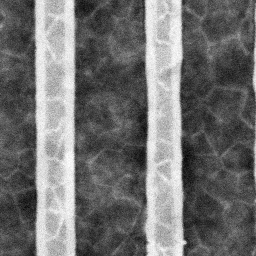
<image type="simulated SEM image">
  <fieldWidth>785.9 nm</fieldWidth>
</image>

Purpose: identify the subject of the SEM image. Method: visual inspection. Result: one or a few lines or trenches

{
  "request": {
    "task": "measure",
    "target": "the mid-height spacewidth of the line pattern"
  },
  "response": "242 nanometers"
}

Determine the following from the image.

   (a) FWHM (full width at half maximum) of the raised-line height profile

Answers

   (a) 30.1 px